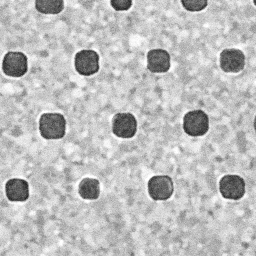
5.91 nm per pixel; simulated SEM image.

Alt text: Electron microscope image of a regular array of holes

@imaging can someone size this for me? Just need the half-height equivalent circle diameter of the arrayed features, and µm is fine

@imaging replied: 0.163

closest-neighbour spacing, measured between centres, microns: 0.422